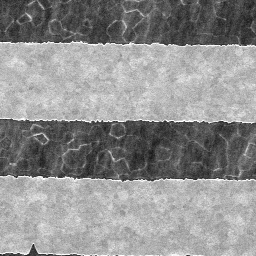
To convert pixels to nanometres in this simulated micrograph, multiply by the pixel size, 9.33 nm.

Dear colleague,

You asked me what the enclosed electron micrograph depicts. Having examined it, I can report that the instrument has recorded one or a few lines or trenches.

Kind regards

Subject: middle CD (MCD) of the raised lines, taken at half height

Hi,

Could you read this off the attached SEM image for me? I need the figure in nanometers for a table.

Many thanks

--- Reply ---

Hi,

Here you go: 712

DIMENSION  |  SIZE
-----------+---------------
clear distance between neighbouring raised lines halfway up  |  536 nm